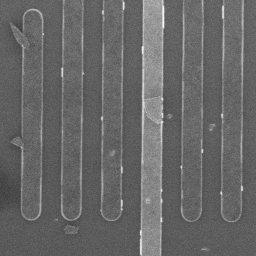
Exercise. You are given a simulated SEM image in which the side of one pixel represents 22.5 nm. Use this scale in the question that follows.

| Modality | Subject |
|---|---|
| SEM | groups of lines, slits or small figures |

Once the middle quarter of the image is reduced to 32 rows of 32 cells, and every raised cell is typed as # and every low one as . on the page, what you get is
#####.....#####.....#####.....##
#####.....#####.....#####.....##
#####.....#####.....#####.....##
#####.....#####.....#####.....##
#####.....#####.....####......##
#####.....#####.....####......##
#####.....#####.....####......##
#####.....#####.....####......##
#####.....#####.....####......##
#####.....#####.....####......##
#####.....#####.....####......##
#####.....#####.....####......##
####......#####.....####......##
####......#####.....####......##
####......#####.....####......##
####......#####.....####......##
####......#####.....####......##
####......####......####......##
####......####......####......##
####......####......####......##
####......####......####......##
####......####......####......##
####......####......####......##
####......####......####......##
####......####......####......##
####......####......####......##
####......####......####......##
####......####......####......##
####......####......####......##
####......####......####......##
####......####......####......##
####......####.....#####......##